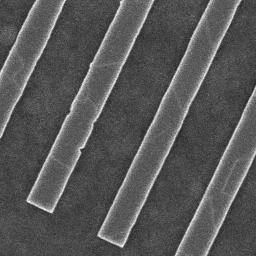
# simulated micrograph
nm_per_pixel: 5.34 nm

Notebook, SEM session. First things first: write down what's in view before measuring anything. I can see one or a few lines or trenches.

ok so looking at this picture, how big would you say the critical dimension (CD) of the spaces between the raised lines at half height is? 0.275 um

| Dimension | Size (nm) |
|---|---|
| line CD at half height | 149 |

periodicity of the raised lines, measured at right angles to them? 419 nm